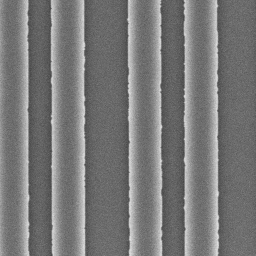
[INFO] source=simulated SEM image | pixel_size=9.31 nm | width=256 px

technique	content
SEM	lines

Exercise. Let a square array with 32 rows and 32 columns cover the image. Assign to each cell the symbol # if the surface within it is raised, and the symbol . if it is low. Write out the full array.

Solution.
###...####......####...####.....
###...####......####...####.....
###...####......####...####.....
###...####......####...####.....
###...####......####...####.....
###...#####.....####...####.....
###...#####.....####...####.....
###...#####.....####...####.....
###...#####.....####...####.....
###...####......####...####.....
###...####......####...####.....
###....###......####...####.....
###....####.....####...####.....
###....####.....####...####.....
###...#####.....####...####.....
###...#####.....####...####.....
###....####.....####...####.....
###....####.....####...####.....
###....####.....####...####.....
###....####.....####...####.....
####..#####.....####...####.....
###....####.....####...####.....
###....####.....####...####.....
####...####.....####...####.....
####...####.....####...####.....
###....####.....####...####.....
###....####.....####...####.....
####...####.....####...####.....
####...####.....####...####.....
####...####.....####...####.....
###....####.....####...####.....
####...####.....####...####.....